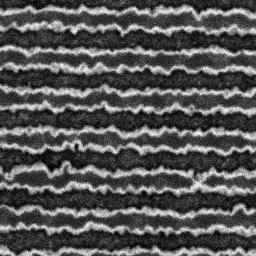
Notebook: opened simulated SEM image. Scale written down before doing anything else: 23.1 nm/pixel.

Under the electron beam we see parallel lines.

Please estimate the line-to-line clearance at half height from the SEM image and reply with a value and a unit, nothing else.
20.2 pixels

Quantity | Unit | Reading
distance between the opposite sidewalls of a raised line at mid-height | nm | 445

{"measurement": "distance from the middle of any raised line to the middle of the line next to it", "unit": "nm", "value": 927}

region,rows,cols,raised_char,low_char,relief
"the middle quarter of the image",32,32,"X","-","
XXXXXXXXXXXXXXXXXXXXXXXXXXXXXXXX
-XXXXXX----XXX---X----XXXXX---XX
--------------------------------
--------------------------------
--------------------------------
---------XX---------------------
-------XXXXXX-------------------
XXXX-XXXXXXXXXXXXXXXXXXXXXXXXXXX
XXXXXXXXXXXXXXXXXXXXXXXXXXXXXXXX
XXXXXXXXXXXXXXXXXXXXXXXXXXXXXXXX
XXXXXXXXXXXXXXXXXXXXXXXXXXXXXXXX
------X------XXX-XX-XXXXXX----XX
--------------------------------
--------------------------------
--------------------------------
--------------------------------
--X-XXXX-XXXX------XX---XXXX----
XXXXXXXXXXXXXX--XXXXXXXXXXXXXXXX
XXXXXXXXXXXXXXXXXXXXXXXXXXXXXXXX
XXXXXXXXXXXXXXXXXXXXXXXXXXXXXXXX
--X-XXXXXXXXXXXX-XXXXXXXXXXXXXXX
----X---XXX-XX-----X-XX---XXXX--
--------------------------------
--------------------------------
--------------------------------
XX------------------------------
XX---XXX----------------XXX-----
XXXXXXXXXXXX-XXXXXXXXXXXXXXXXXXX
XXXXXXXXXXXXXXXXXXXXXXXXXXXXXXXX
XXXXXXXXXXXXXXXXXXXXXXXXXXXXXXXX
XXXXXXXXXXXXXXXXXXXXXXXXXXXXXXXX
X------X----XXXX-XX-XXXXX--XX-XX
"